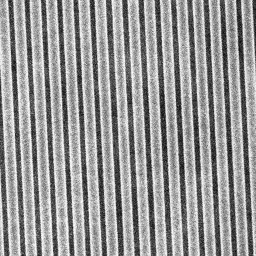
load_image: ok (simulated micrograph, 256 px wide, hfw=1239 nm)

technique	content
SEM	parallel lines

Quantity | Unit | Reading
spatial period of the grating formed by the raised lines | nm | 78.7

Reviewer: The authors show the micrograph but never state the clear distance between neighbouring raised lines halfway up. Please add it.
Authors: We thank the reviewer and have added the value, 27.8 nanometres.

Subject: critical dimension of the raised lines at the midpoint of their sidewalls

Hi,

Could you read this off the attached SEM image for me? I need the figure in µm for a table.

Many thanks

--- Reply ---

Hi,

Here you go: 0.0508